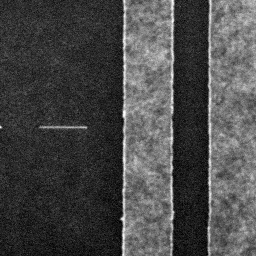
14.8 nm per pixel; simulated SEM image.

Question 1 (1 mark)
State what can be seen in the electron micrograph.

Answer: one or a few lines or trenches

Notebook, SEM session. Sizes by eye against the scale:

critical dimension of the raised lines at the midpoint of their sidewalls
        0.71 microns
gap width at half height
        552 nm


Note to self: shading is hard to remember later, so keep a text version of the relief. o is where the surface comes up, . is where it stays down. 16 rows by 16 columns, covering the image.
........ooo..ooo
........ooo..ooo
........ooo..ooo
........ooo..ooo
........ooo..ooo
........ooo..ooo
........ooo..ooo
........ooo..ooo
........ooo..ooo
........ooo..ooo
........ooo..ooo
........ooo..ooo
........ooo..ooo
........ooo..ooo
........ooo..ooo
........ooo..ooo